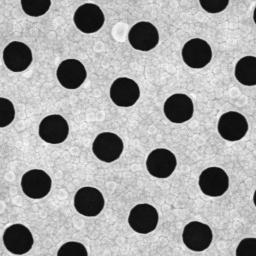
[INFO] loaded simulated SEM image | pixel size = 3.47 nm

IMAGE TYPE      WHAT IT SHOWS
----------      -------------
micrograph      a regular array of holes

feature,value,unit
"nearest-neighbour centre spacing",196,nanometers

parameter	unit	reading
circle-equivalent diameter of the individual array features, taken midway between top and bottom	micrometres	0.102